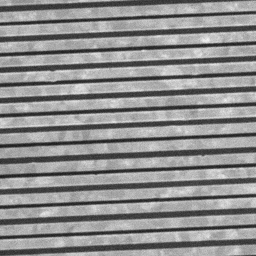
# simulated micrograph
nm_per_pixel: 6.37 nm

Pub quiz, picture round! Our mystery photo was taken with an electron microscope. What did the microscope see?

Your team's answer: parallel lines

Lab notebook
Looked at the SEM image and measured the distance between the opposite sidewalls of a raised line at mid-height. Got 61.3 nm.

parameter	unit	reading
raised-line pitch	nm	96.6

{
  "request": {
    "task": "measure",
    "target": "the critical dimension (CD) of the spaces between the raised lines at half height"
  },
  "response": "0.0382 um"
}